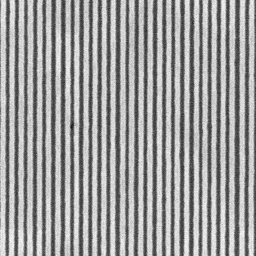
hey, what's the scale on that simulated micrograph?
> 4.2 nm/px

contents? parallel lines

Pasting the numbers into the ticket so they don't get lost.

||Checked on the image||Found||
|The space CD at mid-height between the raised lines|22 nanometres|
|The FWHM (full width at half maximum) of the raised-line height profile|15.2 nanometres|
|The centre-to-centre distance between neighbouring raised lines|38.6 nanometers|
